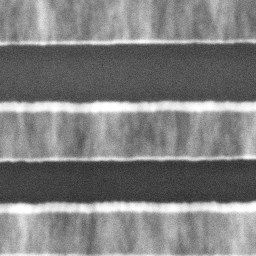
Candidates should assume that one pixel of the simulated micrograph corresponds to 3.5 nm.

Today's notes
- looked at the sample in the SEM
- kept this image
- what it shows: lines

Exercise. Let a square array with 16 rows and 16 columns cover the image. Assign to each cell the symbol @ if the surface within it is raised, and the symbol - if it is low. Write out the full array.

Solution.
@@@@@@@@@@@@@@@@
@@@@@@@@@@@@@@@@
@@@@@@@@@@@@@@@@
----------------
----------------
----------------
----------@-----
@@@@@@@@@@@@@@@@
@@@@@@@@@@@@@@@@
@@@@@@@@@@@@@@@@
----------------
----------------
----------------
@@@@@@@@@@@@@@@@
@@@@@@@@@@@@@@@@
@@@@@@@@@@@@@@@@